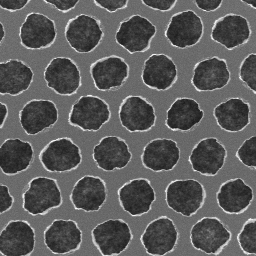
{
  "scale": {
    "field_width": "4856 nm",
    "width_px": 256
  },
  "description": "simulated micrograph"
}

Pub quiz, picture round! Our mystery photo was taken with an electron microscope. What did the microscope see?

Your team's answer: a regular array of holes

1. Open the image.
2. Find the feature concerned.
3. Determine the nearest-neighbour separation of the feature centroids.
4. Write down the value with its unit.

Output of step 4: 869 nm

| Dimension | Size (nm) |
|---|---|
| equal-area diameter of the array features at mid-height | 656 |